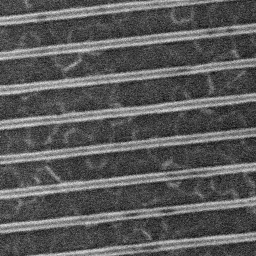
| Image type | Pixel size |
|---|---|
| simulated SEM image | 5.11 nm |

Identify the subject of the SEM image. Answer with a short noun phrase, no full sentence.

parallel lines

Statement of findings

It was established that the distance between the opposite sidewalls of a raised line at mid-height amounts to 38.7 nm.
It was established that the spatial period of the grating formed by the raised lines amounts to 176 nm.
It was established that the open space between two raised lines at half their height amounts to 135 nm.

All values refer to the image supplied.